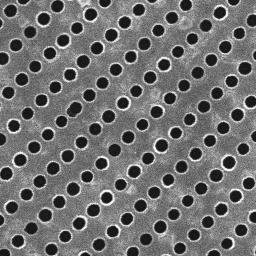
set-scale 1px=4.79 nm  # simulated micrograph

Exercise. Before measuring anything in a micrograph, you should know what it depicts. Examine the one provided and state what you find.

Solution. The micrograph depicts a regular array of holes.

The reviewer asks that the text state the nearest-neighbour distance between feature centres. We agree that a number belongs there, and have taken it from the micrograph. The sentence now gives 89.5 nm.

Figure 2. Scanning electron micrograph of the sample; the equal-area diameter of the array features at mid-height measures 55.6 nm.